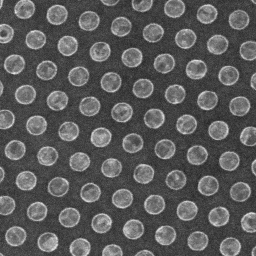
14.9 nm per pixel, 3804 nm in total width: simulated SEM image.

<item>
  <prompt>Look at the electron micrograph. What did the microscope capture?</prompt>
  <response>a regular array of raised bodies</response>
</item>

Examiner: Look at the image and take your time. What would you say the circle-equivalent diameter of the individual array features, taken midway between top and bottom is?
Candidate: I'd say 18.8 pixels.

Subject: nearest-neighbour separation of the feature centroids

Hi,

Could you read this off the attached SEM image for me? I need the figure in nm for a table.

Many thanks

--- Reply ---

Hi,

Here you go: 480